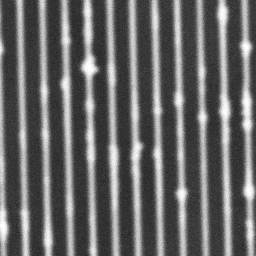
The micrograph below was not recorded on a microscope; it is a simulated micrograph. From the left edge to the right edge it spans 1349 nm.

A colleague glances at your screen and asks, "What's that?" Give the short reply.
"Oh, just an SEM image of parallel lines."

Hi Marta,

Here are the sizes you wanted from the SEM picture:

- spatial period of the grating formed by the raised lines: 119 nanometers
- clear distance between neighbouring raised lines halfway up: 95.5 nm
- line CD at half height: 23.1 nm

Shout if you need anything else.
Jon